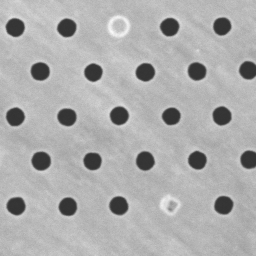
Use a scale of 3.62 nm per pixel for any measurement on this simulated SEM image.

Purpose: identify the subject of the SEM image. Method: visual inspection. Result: a regular array of holes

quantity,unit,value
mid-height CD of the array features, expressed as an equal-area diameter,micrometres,0.0664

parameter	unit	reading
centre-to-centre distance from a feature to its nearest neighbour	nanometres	184